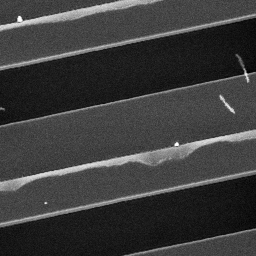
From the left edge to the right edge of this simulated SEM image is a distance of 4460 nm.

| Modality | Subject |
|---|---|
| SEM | lines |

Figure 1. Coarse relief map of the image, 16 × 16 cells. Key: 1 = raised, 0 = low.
1111111111111111
1111111111111100
1111111110000000
1111000000000000
0000000000000000
0000000000011111
0000000111111111
0011111111111111
1111111111111111
1111111111111111
1111111111111111
1111111111110000
1111111000000000
1110000000000000
0000000000000001
0000000000111111